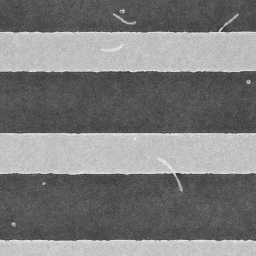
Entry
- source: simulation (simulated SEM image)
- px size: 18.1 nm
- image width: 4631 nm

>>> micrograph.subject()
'lines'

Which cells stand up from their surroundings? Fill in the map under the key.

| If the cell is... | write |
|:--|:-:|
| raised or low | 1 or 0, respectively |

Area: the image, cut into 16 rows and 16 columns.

0000000000000000
0000000000000000
1111111111111111
1111111111111111
0000000000000000
0000000000000000
0000000000000000
0000000000000000
1111111111111111
1111111111111111
1111111111111111
0000000000000000
0000000000000000
0000000000000000
0000000000000000
1111111111111111